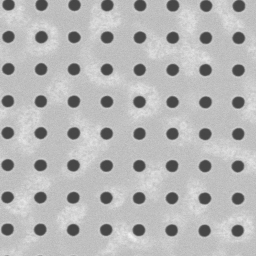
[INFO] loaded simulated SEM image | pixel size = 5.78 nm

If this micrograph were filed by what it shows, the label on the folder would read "a regular array of holes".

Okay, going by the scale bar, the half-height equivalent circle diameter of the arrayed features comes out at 0.0696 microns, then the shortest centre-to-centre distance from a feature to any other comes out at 0.185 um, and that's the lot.